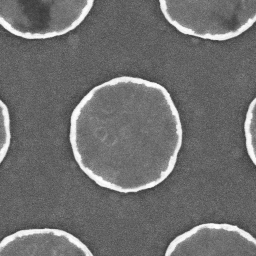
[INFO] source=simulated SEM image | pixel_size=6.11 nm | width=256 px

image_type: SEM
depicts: raised bodies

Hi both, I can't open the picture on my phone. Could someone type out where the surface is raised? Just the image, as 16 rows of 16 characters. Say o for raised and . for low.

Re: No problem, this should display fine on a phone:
oooooo....oooooo
ooooo......ooooo
................
................
................
......oooo......
.....oooooo.....
.....oooooo....o
....ooooooo....o
.....oooooo.....
.....oooooo.....
......oooo......
................
................
.ooo........ooo.
ooooo......ooooo